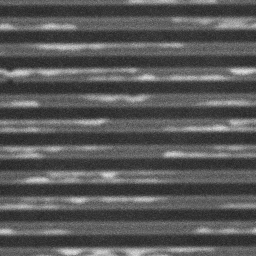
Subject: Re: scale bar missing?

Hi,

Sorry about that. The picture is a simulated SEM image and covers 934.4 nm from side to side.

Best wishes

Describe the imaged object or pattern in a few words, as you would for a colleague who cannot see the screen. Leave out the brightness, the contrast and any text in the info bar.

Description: parallel lines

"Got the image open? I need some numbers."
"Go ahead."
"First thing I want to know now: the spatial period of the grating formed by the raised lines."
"93.4 nm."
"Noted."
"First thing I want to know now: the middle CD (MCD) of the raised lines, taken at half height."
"44.3 nanometers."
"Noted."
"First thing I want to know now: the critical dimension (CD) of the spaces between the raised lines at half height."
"13.1 pixels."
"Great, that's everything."